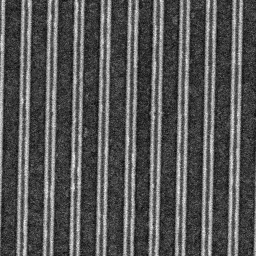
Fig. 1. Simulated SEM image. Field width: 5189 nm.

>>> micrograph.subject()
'parallel lines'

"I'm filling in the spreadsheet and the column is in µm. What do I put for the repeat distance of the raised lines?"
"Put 0.535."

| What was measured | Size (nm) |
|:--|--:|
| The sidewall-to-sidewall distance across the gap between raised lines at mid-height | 388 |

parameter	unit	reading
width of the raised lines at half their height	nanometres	147